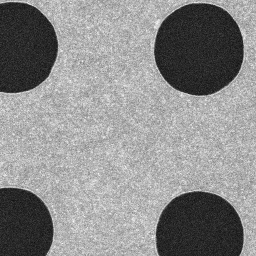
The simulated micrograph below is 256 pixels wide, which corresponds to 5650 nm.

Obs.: holes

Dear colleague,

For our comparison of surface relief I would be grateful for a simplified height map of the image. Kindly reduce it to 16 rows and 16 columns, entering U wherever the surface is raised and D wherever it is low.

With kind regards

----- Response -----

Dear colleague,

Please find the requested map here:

DDUUUUUUUUUDDDUU
DDDUUUUUUUDDDDDU
DDDDUUUUUUDDDDDU
DDDDUUUUUUDDDDDU
DDDUUUUUUUDDDDDU
DDUUUUUUUUUDDDUU
UUUUUUUUUUUUUUUU
UUUUUUUUUUUUUUUU
UUUUUUUUUUUUUUUU
UUUUUUUUUUUUUUUU
UUUUUUUUUUUUUUUU
UUUUUUUUUUUUUUUU
DDDUUUUUUUUDDDUU
DDDUUUUUUUDDDDDU
DDDUUUUUUUDDDDDU
DDDUUUUUUUDDDDDU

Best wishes